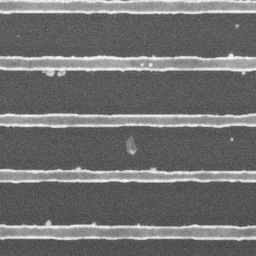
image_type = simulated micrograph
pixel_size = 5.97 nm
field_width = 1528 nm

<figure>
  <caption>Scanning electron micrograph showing lines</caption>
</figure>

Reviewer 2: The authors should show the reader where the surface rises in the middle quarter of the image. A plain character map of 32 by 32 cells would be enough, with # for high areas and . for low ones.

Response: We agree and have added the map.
################################
.....................#..##......
................................
................................
................................
................................
................................
................................
................................
................................
................................
................................
................................
################################
################################
##############.......#########.#
................................
................................
................................
................................
................................
................................
................................
................................
................................
................................
.....#..........................
################################
################################
................................
................................
................................